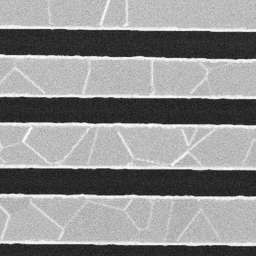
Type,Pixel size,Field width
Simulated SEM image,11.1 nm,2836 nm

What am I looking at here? lines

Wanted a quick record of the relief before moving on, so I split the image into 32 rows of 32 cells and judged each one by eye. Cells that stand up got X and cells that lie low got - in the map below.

XXXXXXXXXXXXXXXXXXXXXXXXXXXXXXXX
XXXXXXXXXXXXXXXXXXXXXXXXXXXXXXXX
XXXXXXXXXXXXXXXXXXXXXXXXXXXXXXXX
XXXXXXXXXXXXXXXXXXXXXXXXXXXXXXXX
--------------------------------
--------------------------------
--------------------------------
XXXXXXXXXXXXXXXXXXXXXXXXXXXXXXXX
XXXXXXXXXXXXXXXXXXXXXXXXXXXXXXXX
XXXXXXXXXXXXXXXXXXXXXXXXXXXXXXXX
XXXXXXXXXXXXXXXXXXXXXXXXXXXXXXXX
XXXXXXXXXXXXXXXXXXXXXXXXXXXXXXXX
--------------------------------
--------------------------------
--------------------------------
XXXXXXX-XXX---X-----------------
XXXXXXXXXXXXXXXXXXXXXXXXXXXXXXXX
XXXXXXXXXXXXXXXXXXXXXXXXXXXXXXXX
XXXXXXXXXXXXXXXXXXXXXXXXXXXXXXXX
XXXXXXXXXXXXXXXXXXXXXXXXXXXXXXXX
XXXXXXXXXXXXXXXXXXXXXXXXXXXXXXXX
--------------------------------
--------------------------------
--------------------------------
XXXXXXXXXXXX----X---------------
XXXXXXXXXXXXXXXXXXXXXXXXXXXXXXXX
XXXXXXXXXXXXXXXXXXXXXXXXXXXXXXXX
XXXXXXXXXXXXXXXXXXXXXXXXXXXXXXXX
XXXXXXXXXXXXXXXXXXXXXXXXXXXXXXXX
XXXXXXXXXXXXXXXXXXXXXXXXXXXXXXXX
------------XX-XXXXXXXXXXXXXXXXX
--------------------------------